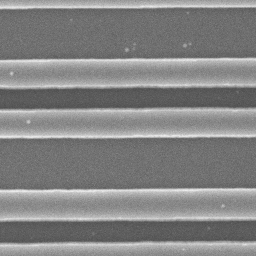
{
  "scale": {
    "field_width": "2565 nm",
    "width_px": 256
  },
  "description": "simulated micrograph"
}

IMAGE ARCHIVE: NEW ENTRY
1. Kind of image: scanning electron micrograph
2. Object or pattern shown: lines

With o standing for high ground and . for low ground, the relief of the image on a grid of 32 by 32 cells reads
oooooooooooooooooooooooooooooooo
................................
................................
................................
................................
................................
................................
................o...oooooooooooo
oooooooooooooooooooooooooooooooo
oooooooooooooooooooooooooooooooo
oooooooooooooooooooooooooooooooo
................................
................................
................................
oooooooooooooooooooooooooooooooo
oooooooooooooooooooooooooooooooo
oooooooooooooooooooooooooooooooo
................................
................................
................................
................................
................................
................................
................................
oooooooooooooooooooooooooooooooo
oooooooooooooooooooooooooooooooo
oooooooooooooooooooooooooooooooo
................................
................................
................................
.................oo.oooooo.ooo.o
oooooooooooooooooooooooooooooooo